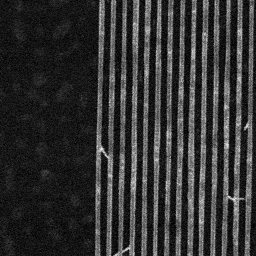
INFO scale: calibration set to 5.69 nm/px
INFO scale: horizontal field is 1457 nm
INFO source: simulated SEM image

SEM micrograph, parallel lines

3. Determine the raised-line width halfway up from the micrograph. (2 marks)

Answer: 3.88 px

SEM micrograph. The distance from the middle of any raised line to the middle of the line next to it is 0.0657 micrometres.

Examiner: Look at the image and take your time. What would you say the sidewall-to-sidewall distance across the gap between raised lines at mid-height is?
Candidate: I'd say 42.7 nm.